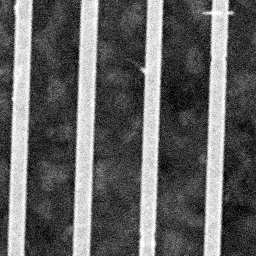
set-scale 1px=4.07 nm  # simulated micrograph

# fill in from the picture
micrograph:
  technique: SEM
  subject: one or a few lines or trenches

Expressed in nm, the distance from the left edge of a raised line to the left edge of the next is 266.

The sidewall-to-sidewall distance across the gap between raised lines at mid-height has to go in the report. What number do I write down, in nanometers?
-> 208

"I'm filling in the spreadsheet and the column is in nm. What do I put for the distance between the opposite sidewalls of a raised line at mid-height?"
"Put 55.9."